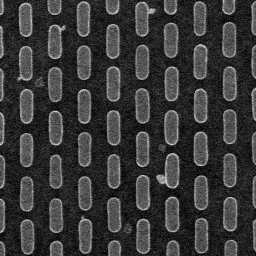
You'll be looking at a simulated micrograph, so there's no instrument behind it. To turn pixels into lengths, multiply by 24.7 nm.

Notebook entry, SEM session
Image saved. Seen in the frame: groups of lines, slits or small figures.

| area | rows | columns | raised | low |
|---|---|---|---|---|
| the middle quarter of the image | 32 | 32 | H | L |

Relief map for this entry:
LLLHHHLLLLLLLLLLLLHHHLLLLLLLLLLL
LLLHHHLLLLLHHHLLLLHHHLLLLHHHLLLL
LLLHHHLLLLLHHHLLLLHHHLLLLHHHLLLL
LLLLHHLLLLLHHHLLLLLHHLLLLHHHLLLL
LLLLLLLLLLLHHHLLLLLLLLLLLHHHLLLL
LLLLLLLLLLLHHHLLLLLLLLLLLHHHLLLL
LLLLHLLLLLLHHHLLLLLHHLLLLHHHLLLL
LLLHHHLLLLLHHHLLLLHHHLLLLHHHLLLL
LLLHHHLLLLLHHHLLLLHHHLLLLHHHLLLL
LLLHHHLLLLLLLLLLLLHHHLLLLLLLLLLL
LLLLHHLLLLLLLLLLLLHHHLLLLLLLLLLL
LLLLHHLLLLLLLLLLLLHHHLLLLLLLLLLL
LLLLHHLLLLLHHHLLLLHHHLLLLHHHLLLL
LLLLHHLLLLLHHHLLLLHHHLLLLHHHLLLL
LLLLHHLLLLLHHHLLLLLHHLLLLHHHLLLL
LLLLLLLLLLLHHHLLLLLLLLLLLHHHLLLL
LLLLLLLLLLLHHHLLLLLLLLLLLHHHLLLL
LLLLHHLLLLLHHHLLLLHHHLLLLHHHLLLL
LLLLHHHLLLLHHHLLLLHHHLLLLHHHLLLL
LLLLHHHLLLLHHHLLLLHHHLLLLLHHLLLL
LLLLHHLLLLLLLLLLLLHHHLLLLLLLLLLL
LLLLHHLLLLLLLLLLLLHHHLLLLLLLLLLL
LLLLHHLLLLLLLLLLLLHHHLLLLLHHLLLL
LLLLHHLLLLLHHHLLLLHHHLLLLLHHLLLL
LLLLHHLLLLLHHHLLLLHHHLLLLHHHHLLL
LLLLLLLLLLLHHHLLLLLHLLLLLHHHHLLL
LLLLLLLLLLLHHHLLLLLLLLLLLHHHHLLL
LLLLLLLLLLLHHHLLLLLLLLLLLHHHHLLL
LLLLHHLLLLLHHHLLLLLHHLLLLHHHLLLL
LLLLHHHLLLLHHHLLLLHHHLLLLHHHLLLL
LLLLHHHLLLLHHHLLLLHHHLLLLLHHLLLL
LLLLHHHLLLLLLLLLLLHHHLLLLLLLLLLL